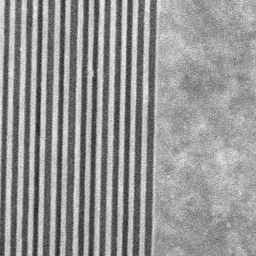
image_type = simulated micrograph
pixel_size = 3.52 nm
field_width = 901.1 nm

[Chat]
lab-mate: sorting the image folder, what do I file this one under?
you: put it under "parallel lines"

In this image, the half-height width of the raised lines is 17.2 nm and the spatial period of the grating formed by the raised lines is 0.0395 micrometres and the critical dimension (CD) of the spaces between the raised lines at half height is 24.2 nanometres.